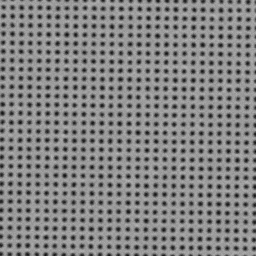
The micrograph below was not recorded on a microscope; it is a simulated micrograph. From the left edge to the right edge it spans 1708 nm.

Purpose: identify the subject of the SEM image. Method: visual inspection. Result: a regular array of holes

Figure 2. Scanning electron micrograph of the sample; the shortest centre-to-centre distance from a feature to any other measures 56.8 nm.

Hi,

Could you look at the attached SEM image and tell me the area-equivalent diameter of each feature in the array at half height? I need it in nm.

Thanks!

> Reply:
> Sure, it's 32.8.